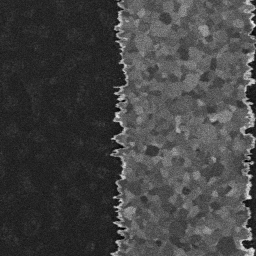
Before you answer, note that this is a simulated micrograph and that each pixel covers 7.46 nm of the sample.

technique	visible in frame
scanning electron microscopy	one or a few lines or trenches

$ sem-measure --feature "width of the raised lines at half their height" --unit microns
0.969